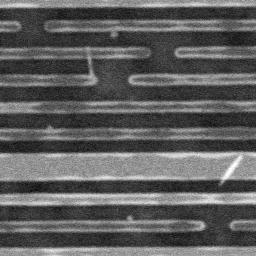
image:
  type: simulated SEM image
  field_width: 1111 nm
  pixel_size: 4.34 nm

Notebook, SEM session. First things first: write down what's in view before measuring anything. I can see groups of lines, slits or small figures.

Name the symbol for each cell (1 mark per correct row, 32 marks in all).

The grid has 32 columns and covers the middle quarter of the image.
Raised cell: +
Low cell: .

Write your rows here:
................................
................................
................................
+++++++..........+++++++++++++++
+++++++..........++++++++++++..+
................................
................................
................................
................................
................................
++++++++++++++++++++++++++++++++
++++++++++++++++++++++++++++++++
................................
................................
................................
................................
........++++.........++++++.....
++++++++++++++++++++++++++++++++
++++++++++++++...++++++++++.....
................................
................................
................................
..........+++....+++++++.......+
++++++++++++++++++++++++++++++++
++++++++++++++++++++++++++++++++
++++++++++++++++++++++++++++++++
++++++++++++++++++++++++++++++++
++++++++++++++++++++++++++++++++
+.+++++++..++++++..++++.++++++++
................................
................................
................................